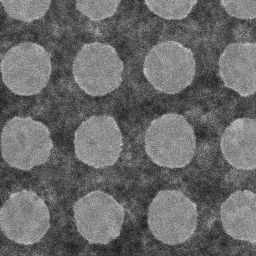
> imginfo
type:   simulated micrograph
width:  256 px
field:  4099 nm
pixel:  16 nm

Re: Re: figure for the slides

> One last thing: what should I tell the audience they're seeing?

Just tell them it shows raised bodies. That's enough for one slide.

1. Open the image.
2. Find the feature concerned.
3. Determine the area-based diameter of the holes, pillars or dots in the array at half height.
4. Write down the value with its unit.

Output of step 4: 821 nanometers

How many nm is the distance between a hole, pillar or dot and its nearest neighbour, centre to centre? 1150